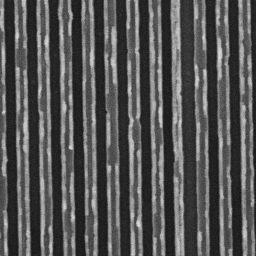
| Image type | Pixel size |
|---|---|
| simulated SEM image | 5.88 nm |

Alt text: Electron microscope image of parallel lines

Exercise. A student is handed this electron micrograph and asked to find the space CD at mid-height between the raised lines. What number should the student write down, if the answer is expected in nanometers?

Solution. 64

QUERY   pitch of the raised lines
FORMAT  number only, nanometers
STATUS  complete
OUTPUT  132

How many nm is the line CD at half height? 66.9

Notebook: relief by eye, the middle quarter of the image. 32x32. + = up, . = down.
++...++...+++...+++...++...++...
++...++....++...+++...++...++...
++...+++...++...+++...++...++...
++...+++...++...+++...++...++...
++...+++...++...+++...++...++...
++...+++..+++...+++...++...++...
++...+++..+++...+++...++...++...
++...+++..+++...+++...++...++...
++...+++...++...+++...++...++...
++...+++...++...+++...+++..++...
++...+++...++...+++...+++..++...
++...+++...++...+++...++...++...
++...+++...++...+++...++...++...
++...+++...++...+++...++...++...
++...+++...++...+++...++...++...
++...+++...++...+++...+++..++...
++...+++...++...+++...+++..++...
++...+++...++...+++...+++..++...
++...+++...++...+++...+++..++...
++...+++...++...+++...+++..++...
++...+++...++...+++...+++...+...
++...+++...+++...++...+++...++..
++...+++...+++...++...+++...++..
++...+++...+++...++...+++...++..
++...+++...+++...++...+++...++..
++...+++...+++...++...+++...+...
++...+++...+++..+++...+++...+...
++...+++...+++..+++...+++...++..
++...+++...+++..+++...+++...++..
++...+++...+++...++...+++...++..
++...+++...+++...++...+++...++..
++...+++...+++...++...+++...++..